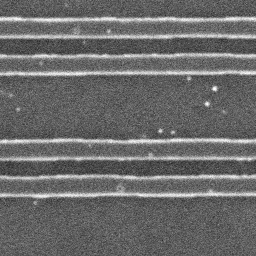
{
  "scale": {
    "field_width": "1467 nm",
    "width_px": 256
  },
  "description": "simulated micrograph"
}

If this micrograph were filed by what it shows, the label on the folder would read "lines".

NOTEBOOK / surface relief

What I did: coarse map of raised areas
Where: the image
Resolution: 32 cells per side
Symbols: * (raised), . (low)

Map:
................................
................................
********************************
********************************
********************************
................................
................................
********************************
********************************
................................
................................
................................
................................
................................
................................
................................
................................
.......****..........********...
********************************
********************************
................................
................................
********************************
********************************
....**..........................
................................
................................
................................
................................
................................
................................
................................